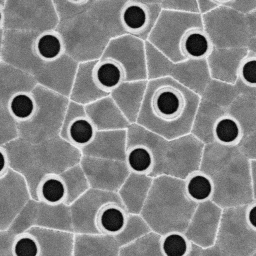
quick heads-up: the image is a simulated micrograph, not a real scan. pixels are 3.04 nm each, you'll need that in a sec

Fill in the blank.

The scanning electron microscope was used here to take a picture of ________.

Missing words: a regular array of holes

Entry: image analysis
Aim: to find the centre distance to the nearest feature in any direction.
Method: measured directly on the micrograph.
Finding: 193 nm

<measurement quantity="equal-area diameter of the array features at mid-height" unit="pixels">25.1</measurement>